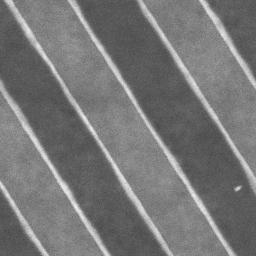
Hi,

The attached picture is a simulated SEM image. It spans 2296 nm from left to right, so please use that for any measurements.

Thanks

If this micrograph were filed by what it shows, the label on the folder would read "lines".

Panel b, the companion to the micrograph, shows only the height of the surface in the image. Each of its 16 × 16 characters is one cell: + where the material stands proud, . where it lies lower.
+....++++....+++
++...+++++....++
++....++++....++
+++....++++....+
+++....+++++...+
++++....++++....
.++++...+++++...
.++++....+++++..
..++++....++++..
...++++...+++++.
...++++....++++.
....++++....++++
+...++++....++++
+....++++....+++
++....++++...+++
+++...++++....++